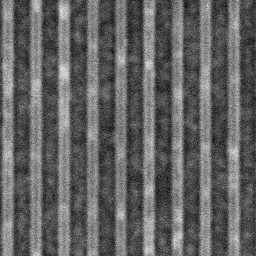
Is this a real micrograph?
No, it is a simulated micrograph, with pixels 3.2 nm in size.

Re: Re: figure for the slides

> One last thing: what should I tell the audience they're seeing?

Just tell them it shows parallel lines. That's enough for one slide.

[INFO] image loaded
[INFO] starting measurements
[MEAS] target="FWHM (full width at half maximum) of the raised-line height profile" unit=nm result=28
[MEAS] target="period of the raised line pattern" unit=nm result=90.2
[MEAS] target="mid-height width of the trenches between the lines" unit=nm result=62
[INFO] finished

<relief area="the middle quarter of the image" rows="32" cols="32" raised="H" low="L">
HLLLLLHHLLLLLHHLLLLLHHLLLLLHHLLL
HLLLLLHHLLLLLHHLLLLLHHLLLLLHHLLL
HLLLLLHHLLLLLHHLLLLLHHLLLLLHHLLL
HLLLLLHHLLLLLHHLLLLLHHLLLLLHHLLL
HLLLLLHHLLLLLHHLLLLLHHLLLLLHHLLL
HLLLLLHHLLLLLHHLLLLLHHLLLLLHHHLL
HLLLLLHHLLLLLHHLLLLLHHLLLLLHHHLL
HLLLLLHHLLLLLHHLLLLLHHLLLLLHHLLL
HLLLLLHHLLLLLHHLLLLLHHLLLLLHHLLL
HLLLLLHHLLLLLHHLLLLLHHLLLLLHHHLL
HLLLLLHHLLLLLHHLLLLLHHLLLLLHHLLL
HLLLLLHHLLLLLHHLLLLLHHLLLLLHHLLL
HLLLLLHHLLLLLHHLLLLLHHLLLLLHHLLL
HLLLLLHHLLLLLHHLLLLLHHLLLLLHHHLL
HLLLLLHHLLLLLHHLLLLLHHLLLLLHHHLL
HLLLLLHHLLLLLHHLLLLLHHLLLLLHHLLL
HLLLLLHHLLLLLHHLLLLLHHLLLLLHHLLL
HLLLLLHHLLLLLHHLLLLLHHLLLLLHHLLL
HLLLLLHHLLLLLHHLLLLLHHLLLLLHHLLL
HLLLLLHHLLLLLHHLLLLLHHLLLLLHHLLL
HLLLLLHHLLLLLHHLLLLLHHLLLLLHHLLL
HLLLLLHHLLLLLHHLLLLLHHLLLLLHHLLL
HLLLLLHHLLLLLHHLLLLLHHLLLLLHHLLL
HLLLLLHHLLLLLHHLLLLLHHLLLLLHHLLL
HLLLLLHHLLLLLHHLLLLLHHLLLLLHHLLL
HLLLLLHHLLLLLHHLLLLLHHLLLLLHHLLL
HLLLLLHHLLLLLHHLLLLLHHLLLLLHHHLL
HLLLLLHHLLLLLHHLLLLLHHLLLLLHHHLL
HLLLLLHHLLLLLHHLLLLLHHLLLLLHHHLL
HLLLLLHHLLLLLHHLLLLLHHLLLLLHHHLL
HLLLLLHHLLLLLHHLLLLLHHLLLLLHHHLL
HLLLLLHHLLLLLHHLLLLLHHLLLLLHHLLL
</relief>